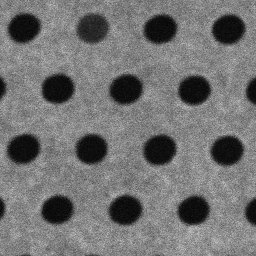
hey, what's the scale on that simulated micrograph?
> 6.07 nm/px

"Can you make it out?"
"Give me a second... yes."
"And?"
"a regular array of holes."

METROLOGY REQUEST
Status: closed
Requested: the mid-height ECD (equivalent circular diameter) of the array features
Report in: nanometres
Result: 192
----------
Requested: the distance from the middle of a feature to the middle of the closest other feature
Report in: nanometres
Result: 413